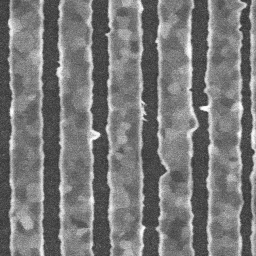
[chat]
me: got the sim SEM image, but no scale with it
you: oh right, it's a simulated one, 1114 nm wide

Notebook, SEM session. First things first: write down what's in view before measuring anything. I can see parallel lines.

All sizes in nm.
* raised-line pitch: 215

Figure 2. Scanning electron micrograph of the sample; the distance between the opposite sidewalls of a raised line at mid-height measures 31.2 pixels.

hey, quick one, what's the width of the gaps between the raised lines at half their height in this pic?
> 17.4 pixels